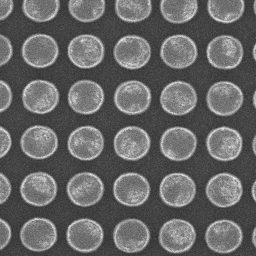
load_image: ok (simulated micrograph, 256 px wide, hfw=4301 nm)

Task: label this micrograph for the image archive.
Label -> a regular array of raised bodies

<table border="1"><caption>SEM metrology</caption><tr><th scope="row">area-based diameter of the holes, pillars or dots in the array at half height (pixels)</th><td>34.5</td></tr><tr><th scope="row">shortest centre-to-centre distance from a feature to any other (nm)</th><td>767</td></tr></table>